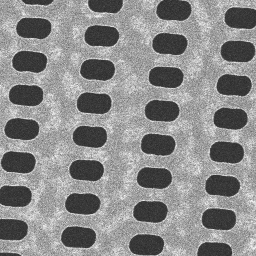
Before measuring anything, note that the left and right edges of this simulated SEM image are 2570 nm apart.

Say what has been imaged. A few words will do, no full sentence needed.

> a regular array of holes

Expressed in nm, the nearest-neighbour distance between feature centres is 338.